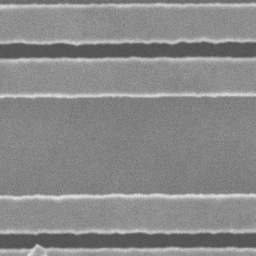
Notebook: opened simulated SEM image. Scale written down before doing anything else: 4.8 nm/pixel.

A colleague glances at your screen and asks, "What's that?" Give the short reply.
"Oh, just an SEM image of lines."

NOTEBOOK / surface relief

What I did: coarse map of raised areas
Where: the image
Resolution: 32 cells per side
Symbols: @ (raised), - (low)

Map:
-------------------@@------@---@
@@@@@@@@@@@@@@@@@@@@@@@@@@@@@@@@
@@@@@@@@@@@@@@@@@@@@@@@@@@@@@@@@
@@@@@@@@@@@@@@@@@@@@@@@@@@@@@@@@
@@@@@@@@@@@@@@@@@@@@@@@@@@@@@@@@
----@@@--@@@---------@----------
--------------------------------
@@@@@@@@@@@@@@@@@@@@@@@@@@@@@@@@
@@@@@@@@@@@@@@@@@@@@@@@@@@@@@@@@
@@@@@@@@@@@@@@@@@@@@@@@@@@@@@@@@
@@@@@@@@@@@@@@@@@@@@@@@@@@@@@@@@
@@@@@@@@@@@@@@@@@@@@@@@@@@@@@@@@
--------------------------------
--------------------------------
--------------------------------
--------------------------------
--------------------------------
--------------------------------
--------------------------------
--------------------------------
--------------------------------
--------------------------------
--------------------------------
--------------------------------
----@---@@@@-@@@@@@@@@@@@@@@@@@@
@@@@@@@@@@@@@@@@@@@@@@@@@@@@@@@@
@@@@@@@@@@@@@@@@@@@@@@@@@@@@@@@@
@@@@@@@@@@@@@@@@@@@@@@@@@@@@@@@@
@@@@@@@@@@@@@@@@@@@@@@@@@@@@@@@@
--------------------------------
--------------------------------
@@@@@@@@@@@@@@@@@@@@@@@@@@@@@@@@